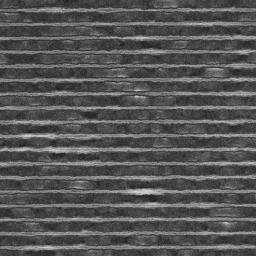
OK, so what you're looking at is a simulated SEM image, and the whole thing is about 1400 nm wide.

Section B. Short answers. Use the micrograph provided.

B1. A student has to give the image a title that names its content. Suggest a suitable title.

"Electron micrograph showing parallel lines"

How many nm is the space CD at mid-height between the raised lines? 61.5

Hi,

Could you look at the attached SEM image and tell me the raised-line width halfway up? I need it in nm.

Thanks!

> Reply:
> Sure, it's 14.4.